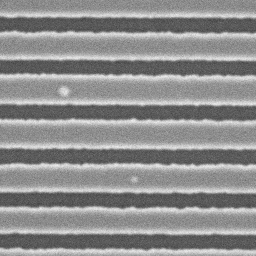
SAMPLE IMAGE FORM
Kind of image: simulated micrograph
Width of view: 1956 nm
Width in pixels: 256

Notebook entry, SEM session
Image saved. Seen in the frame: lines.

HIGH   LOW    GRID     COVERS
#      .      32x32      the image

################################
################################
................................
................................
################################
################################
################################
.............##.#.####..########
................................
##################..##..........
################################
################################
################################
................................
................................
################################
################################
################################
.#.#############################
................................
................................
################################
################################
################################
................................
................................
################################
################################
################################
................................
................................
################################